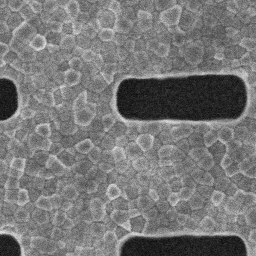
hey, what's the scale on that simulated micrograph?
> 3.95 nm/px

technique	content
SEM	holes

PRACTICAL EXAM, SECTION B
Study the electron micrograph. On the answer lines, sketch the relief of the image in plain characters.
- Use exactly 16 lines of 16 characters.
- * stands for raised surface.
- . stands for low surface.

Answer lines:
****************
****************
****************
****************
****************
.******........*
.******........*
********..*....*
****************
****************
****************
****************
****************
****************
****************
.*******.......*